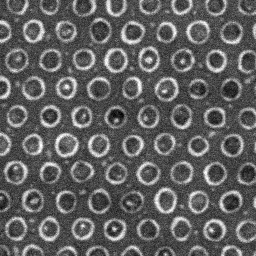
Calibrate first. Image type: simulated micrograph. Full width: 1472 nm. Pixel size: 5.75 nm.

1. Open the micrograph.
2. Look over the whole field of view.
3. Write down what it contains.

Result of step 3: a regular array of raised bodies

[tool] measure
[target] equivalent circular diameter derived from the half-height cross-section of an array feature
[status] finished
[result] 20.7 pixels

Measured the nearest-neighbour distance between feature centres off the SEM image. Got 182 nanometres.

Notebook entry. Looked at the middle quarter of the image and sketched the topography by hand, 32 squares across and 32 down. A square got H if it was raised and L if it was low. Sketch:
LLLHHHHLLLLHHHHLLLLHHHHLLLLLHHHH
LLLLLLLLLLLLHHLLLLLLHHLLLLLLHHHL
LLLLLLLLLLLLLLLLLLLLLLLLLLLLLLLL
LLLLLLLLLLLLLLLLLLLLLLLLLLLLLLLL
HHHLLLLHHHHLLLLHHHHLLLLLHHHHLLLL
HHHLLLHHHHHLLLLHHHHLLLLHHHHHLLLH
HHHLLLHHHHHLLLLHHHHLLLLHHHHHLLLH
HHLLLLHHHHHLLLLHHHHLLLLHHHHHLLLL
LLLLLLLHHHLLLLLLLLLLLLLLHHHLLLLL
LLLLLLLLLLLLLLLLLLLLLLLLLLLLLLLL
LLLLLLLLLLLLLLLLLLLLLHLLLLLLHHHL
LLLHHHLLLLLLHHLLLLLHHHHLLLLHHHHL
LLLHHHHLLLLHHHHLLLLHHHHLLLLHHHHH
LLHHHHHLLLHHHHHLLLLHHHHLLLLHHHHH
LLLHHHHLLLLHHHHLLLLHHHHLLLLHHHHL
LLLHHHLLLLLHHHLLLLLLHHLLLLLLLHHL
LLLLLLLLLLLLLLLLLLLLLLLLLLLLLLLL
LLLLLLLLLLLLLLLLLLLLLLLLLLLLLLLL
HHHLLLLHHHHLLLLLHHHLLLLHHHHLLLLL
HHHLLLLHHHHLLLLHHHHLLLLHHHHLLLLL
HHHLLLLHHHHLLLLHHHHLLLLHHHHLLLLH
HHHLLLLHHHHLLLLHHHHLLLLHHHHLLLLL
HHLLLLLHHHLLLLLLHHLLLLLLLHLLLLLL
LLLLLLLLLLLLLLLLLLLLLLLLLLLLLLLL
LLLHHLLLLLLLLLLLLLLLLLLLLLLLLLLL
LLHHHHHLLLLLHHHLLLLLHHHLLLLHHHHL
LLHHHHHLLLLHHHHHLLLHHHHHLLLHHHHH
LLHHHHHLLLLHHHHHLLLHHHHHLLLHHHHH
LLHHHHLLLLLHHHHLLLLHHHHLLLLHHHHL
LLLLLLLLLLLLHHHLLLLLHHLLLLLLHHLL
LLLLLLLLLLLLLLLLLLLLLLLLLLLLLLLL
LLLLLLLLLLLLLLLLLLLLLLLLLHLLLLLL